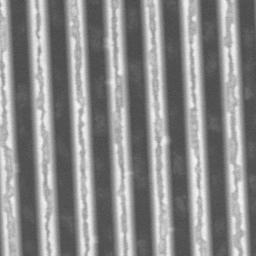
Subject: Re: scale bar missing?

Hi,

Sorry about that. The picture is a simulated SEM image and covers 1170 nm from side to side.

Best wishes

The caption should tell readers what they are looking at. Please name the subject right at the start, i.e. parallel lines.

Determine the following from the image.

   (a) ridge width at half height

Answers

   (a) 86.1 nanometres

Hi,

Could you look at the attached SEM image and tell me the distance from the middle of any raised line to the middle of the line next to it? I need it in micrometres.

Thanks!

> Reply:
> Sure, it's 0.174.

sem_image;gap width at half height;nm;90.1